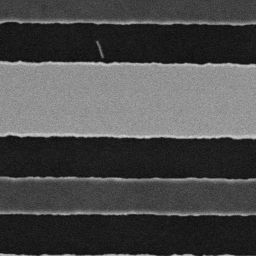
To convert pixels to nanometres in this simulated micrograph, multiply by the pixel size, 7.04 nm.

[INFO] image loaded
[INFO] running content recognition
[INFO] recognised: lines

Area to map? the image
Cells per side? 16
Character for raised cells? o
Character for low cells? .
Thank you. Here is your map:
oooooooooooooooo
......ooo.oooooo
................
................
oooooooooooooooo
oooooooooooooooo
oooooooooooooooo
oooooooooooooooo
oooooooooooooooo
................
................
oooooooooooooooo
oooooooooooooooo
................
................
................